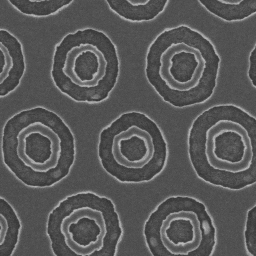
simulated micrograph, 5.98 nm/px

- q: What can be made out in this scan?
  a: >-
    ring-shaped grooves with a dot in the middle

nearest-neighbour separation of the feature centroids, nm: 566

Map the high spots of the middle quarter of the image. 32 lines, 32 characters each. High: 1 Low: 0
11000000110000111111100011100000
11000000110000111111100011000000
11100000110000111111100011100000
01110001100001111111100011110000
00111111100001111111100000111011
00001111000001111111110000111111
00000000000011111111111000001110
00000000000111111111111100000000
11000000000111111111111110000000
11111100111111111111111111000000
11111111111111111111111111110011
11111111111111111111111111111111
11111111111111100000111111111111
11111111111111000000011111111111
11111111111100000000000111111111
01111111111000000000000111111111
01111111110000001111000011111110
00111111100000111111100011111110
00111111100011111000110001111110
00111111100011000000110001111110
00111111100011000000010000111110
00011111100011000000010000111110
00111111100011100000010000111110
00011111100001100000110000111111
00111111100001111011100001111111
00111111110000011111000001111111
01111111110000000000000001111111
01111111111100000000000111111111
11111111111110000000001111111111
11111111111111000001111111111111
11111111111111111111111111111111
11111111111111111111111111111111